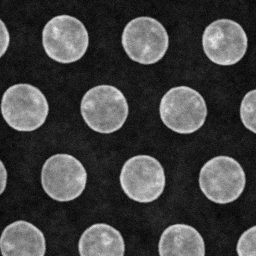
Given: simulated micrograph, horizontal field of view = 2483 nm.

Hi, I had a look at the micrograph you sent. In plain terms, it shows a regular array of raised bodies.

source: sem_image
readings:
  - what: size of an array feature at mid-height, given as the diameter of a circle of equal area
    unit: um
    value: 0.446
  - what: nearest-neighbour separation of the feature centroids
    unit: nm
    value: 770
